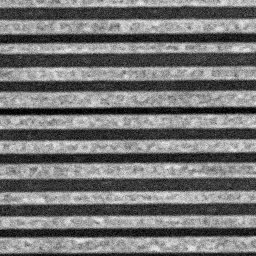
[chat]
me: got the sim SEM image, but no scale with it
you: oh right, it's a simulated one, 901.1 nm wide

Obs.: parallel lines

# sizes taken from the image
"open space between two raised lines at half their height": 40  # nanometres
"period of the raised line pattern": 0.0853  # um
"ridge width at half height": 0.0461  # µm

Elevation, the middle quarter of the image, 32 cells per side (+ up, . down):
................................
++++++++++++++++++++++++++++++++
++++++++++++++++++++++++++++++++
++++++++++++++++++++++++++++++++
................................
................................
................................
++++++++++++++++++++++++++++++++
++++++++++++++++++++++++++++++++
++++++++++++++++++++++++++++++++
++++++++++++++++++++++++++++++++
................................
................................
++++++++++++++++++++++++++++++++
++++++++++++++++++++++++++++++++
++++++++++++++++++++++++++++++++
................................
................................
................................
++++++++++++++++++++++++++++++++
++++++++++++++++++++++++++++++++
++++++++++++++++++++++++++++++++
................................
................................
................................
++++++++++++++++++++++++++++++++
++++++++++++++++++++++++++++++++
++++++++++++++++++++++++++++++++
................................
................................
................................
................................